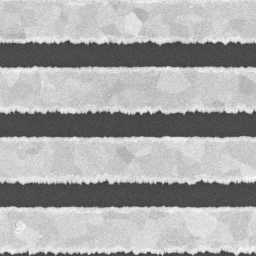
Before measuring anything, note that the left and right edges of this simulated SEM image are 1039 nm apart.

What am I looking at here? lines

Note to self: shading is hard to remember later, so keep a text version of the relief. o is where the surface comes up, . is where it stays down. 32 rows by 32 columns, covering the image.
oooooooooooooooooooooooooooooooo
oooooooooooooooooooooooooooooooo
oooooooooooooooooooooooooooooooo
oooooooooooooooooooooooooooooooo
oooooooooooooooooooooooooooooooo
................................
................................
................................
oooooooooooooooooooooooooooooooo
oooooooooooooooooooooooooooooooo
oooooooooooooooooooooooooooooooo
oooooooooooooooooooooooooooooooo
oooooooooooooooooooooooooooooooo
oooooooooooooooooooooooooooooooo
................................
................................
................................
oooooooooooooooooooooooooooooooo
oooooooooooooooooooooooooooooooo
oooooooooooooooooooooooooooooooo
oooooooooooooooooooooooooooooooo
oooooooooooooooooooooooooooooooo
oooooooooooooooooooooooooooooooo
................................
................................
................................
oooooooooooooooooooooooooooooooo
oooooooooooooooooooooooooooooooo
oooooooooooooooooooooooooooooooo
oooooooooooooooooooooooooooooooo
oooooooooooooooooooooooooooooooo
ooooooooooooooo.ooooooooo.o..ooo